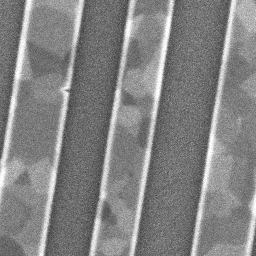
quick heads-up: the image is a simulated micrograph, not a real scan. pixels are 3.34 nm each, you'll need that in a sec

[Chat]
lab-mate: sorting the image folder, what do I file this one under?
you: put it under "one or a few lines or trenches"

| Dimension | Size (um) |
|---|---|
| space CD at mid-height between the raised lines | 0.184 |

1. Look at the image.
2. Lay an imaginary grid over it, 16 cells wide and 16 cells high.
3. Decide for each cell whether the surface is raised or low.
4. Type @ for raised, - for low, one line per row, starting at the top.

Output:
--@@@---@@@----@
--@@@---@@@---@@
-@@@@---@@----@@
-@@@@---@@----@@
-@@@----@@----@@
-@@@---@@@----@@
-@@@---@@@----@@
-@@@---@@@---@@@
@@@@---@@----@@@
@@@@---@@----@@@
@@@----@@----@@@
@@@---@@@----@@@
@@@---@@@----@@@
@@@---@@@---@@@@
@@@---@@@---@@@@
@@@---@@----@@@@